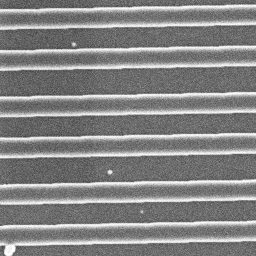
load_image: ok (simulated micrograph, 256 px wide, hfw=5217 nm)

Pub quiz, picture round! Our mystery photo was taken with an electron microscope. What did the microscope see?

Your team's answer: lines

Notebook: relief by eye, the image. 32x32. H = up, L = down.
LLLLLLLLLLLLLLLLLLLLLLLLLLLLLLLL
HHHHHHHHHHHHHHHHHHHHHHHHHHHHHHHH
HHHHHHHHHHHHHHHHHHHHHHHHHHHHHHHH
HHLLLLLLLLLLLLLLLLLLLLLLLLLLLLLL
LLLLLLLLLLLLLLLLLLLLLLLLLLLLLLLL
LLLLLLLLLLLLLLLLLLLLLLLLLLLLLLLL
HHHHHHHHHHHHHHHHHHHHHHHHHHHHHHHH
HHHHHHHHHHHHHHHHHHHHHHHHHHHHHHHH
HHHHHHHHHHHHHHHLLLLLLLLLLLLLLLLL
LLLLLLLLLLLLLLLLLLLLLLLLLLLLLLLL
LLLLLLLLLLLLLLLLLLLLLLLLLLLLLLLL
LLLLLLLLLLLLLLLLLLLLLLLLLLLLLLLL
HHHHHHHHHHHHHHHHHHHHHHHHHHHHHHHH
HHHHHHHHHHHHHHHHHHHHHHHHHHHHHHHH
HHHHLLLLLLLLLLLLLLLLLLLLLLLLLLLL
LLLLLLLLLLLLLLLLLLLLLLLLLLLLLLLL
LLLLLLLLLLLLLLLLLLLLLLLLLLLLLLLL
HHHHHHHHHHHHHHHHHHHHHHHHHHHHHHHH
HHHHHHHHHHHHHHHHHHHHHHHHHHHHHHHH
HHHHHHHHHHHLLLLLLLLLLLLLLLLLLLLL
LLLLLLLLLLLLLLLLLLLLLLLLLLLLLLLL
LLLLLLLLLLLLLLLLLLLLLLLLLLLLLLLL
LLLLLLLLLLLLLLLLLLLLLLLLLLLLLLLL
HHHHHHHHHHHHHHHHHHHHHHHHHHHHHHHH
HHHHHHHHHHHHHHHHHHHHHHHHHHHHHHHH
LLLLLLLLLLLLLLLLLLLLLLLLLLLLLLLL
LLLLLLLLLLLLLLLLLLLLLLLLLLLLLLLL
LLLLLLLLLLLLLLLLLLLLLLLLLLLLLLLL
HHHHHHHHHHHHHHHHHHHHHHHHHHHHHHHH
HHHHHHHHHHHHHHHHHHHHHHHHHHHHHHHH
HHHHHHLLLLLLLLLLLLLLLLLLLLLLLLLL
LHLLLLLLLLLLLLLLLLLLLLLLLLLLLLLL